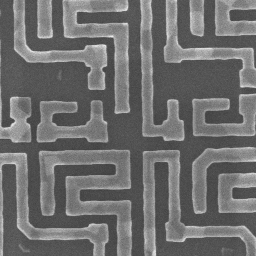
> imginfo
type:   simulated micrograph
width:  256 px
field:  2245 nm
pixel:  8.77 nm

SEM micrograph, wiring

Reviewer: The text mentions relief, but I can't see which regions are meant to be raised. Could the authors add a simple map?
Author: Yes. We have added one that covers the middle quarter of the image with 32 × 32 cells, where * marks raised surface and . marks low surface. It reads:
......****...***...***..........
.......***...***...***..........
......****...***....**..........
......****...***...***..........
......****...***...***..........
......****...***...***..........
.............***...***..........
.............***...***..........
.............***...***..........
.......***...***....**....**....
***....***...***....**....**....
***....***...***....**....**....
.......***..........**....**....
.......***..........**....***...
......****..........**...*****..
....*******.........**********..
***********.........**********..
***********.........**********..
.....******..............*****..
................................
................................
............*...................
****************....*********...
****************....*********...
****************....***...***...
.............***....**....***...
.............***....**....***...
.............***....**....***...
.***************....**....***...
.****************...***...***...
.****************...***...***...
.***................***...***...